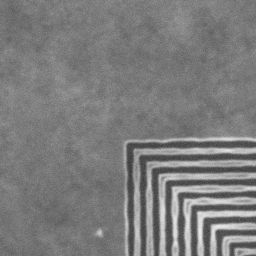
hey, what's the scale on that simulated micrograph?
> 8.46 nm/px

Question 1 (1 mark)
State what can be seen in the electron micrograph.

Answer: groups of lines, slits or small figures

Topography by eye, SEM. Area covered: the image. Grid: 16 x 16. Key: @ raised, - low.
@@@@@@@@@@@@@@@@
@@@@@@@@@@@@@@@@
@@@@@@@@@@@@@@@@
@@@@@@@@@@@@@@@@
@@@@@@@@@@@@@@@@
@@@@@@@@@@@@@@@@
@@@@@@@@@@@@@@@@
@@@@@@@@@@@@@@@@
@@@@@@@@@@@@@@@@
@@@@@@@@--------
@@@@@@@@--------
@@@@@@@@--------
@@@@@@@@--------
@@@@@@@@--------
@@@@@@@@--------
@@@@@@@@--------